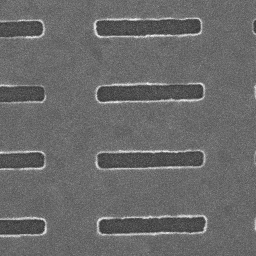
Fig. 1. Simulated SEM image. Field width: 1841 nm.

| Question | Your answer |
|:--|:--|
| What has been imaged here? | holes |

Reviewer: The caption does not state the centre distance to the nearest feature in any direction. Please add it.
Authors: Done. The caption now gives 470 nm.